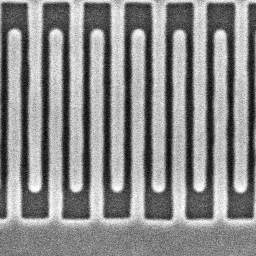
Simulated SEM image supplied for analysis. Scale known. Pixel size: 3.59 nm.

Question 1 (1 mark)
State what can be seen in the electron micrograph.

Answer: groups of lines, slits or small figures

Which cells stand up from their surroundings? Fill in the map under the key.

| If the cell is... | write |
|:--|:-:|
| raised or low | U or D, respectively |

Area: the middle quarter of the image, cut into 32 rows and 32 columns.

DDUUUDDUUUDDUUUDDUUUDDUUUDDUUUDD
DDUUUDDUUUDDUUUDDUUUDDUUUDDUUUDD
DDUUUDDUUUDDUUUDDUUUDDUUUDDUUUDD
DDUUUDDUUUDDUUUDDUUUDDUUUDDUUUDD
DDUUUDDUUUDDUUUDDUUUDDUUUDDUUUDD
DDUUUDDUUUDDUUUDDUUUDDUUUDDUUUDD
DDUUUDDUUUDDUUUDDUUUDDUUUDDDUUDD
DDUUUDDUUUDDUUUDDUUUDDUUUDDDUUDD
DDUUUDDUUUDDUUUDDUUUDDUUUDDUUUDD
DDUUUDDUUUDDUUUDDUUUDDUUUDDUUUDD
DDUUUDDUUUDDUUUDDUUUDDUUUDDUUUDD
DDUUUDDUUUDDUUUDDUUUDDUUUDDUUUDD
DDUUDDDUUUDDUUUDDUUUDDUUUDDUUUDD
DDUUDDDUUUDDUUUDDUUUDDUUUDDUUUDD
DDUUDDDUUUDDUUUDDUUUDDUUUDDUUUDD
DDUUUDDUUUDDUUUDDUUUDDUUUDDUUUDD
DDUUUDDUUUDDUUUDDUUUDDUUUDDUUUDD
DDUUUDDUUUDDUUUDDUUUDDUUUDDUUUDD
DDUUUDDUUUDDUUUDDUUUDDUUUDDUUUDD
DDUUUDDUUUDDUUUDDUUUDDUUUDDUUUDD
DDUUUDDUUUDDUUUDDUUUDDUUUDDUUUDD
DDUUUDDUUUDDUUUDDUUUDDUUUDDUUUDD
DDUUDDDUUDDDUUUDDUUUDDUUUDDUUUDD
DDUUDDDUUDDDUUUDDUUUDDUUUDDUUUDD
DUUUDDDUUDDDUUUDDUUUDDUUUDDUUUDD
DUUUDDDUUDDDUUUDDUUUDDUUUDDUUUDD
DUUUDDDUUDDDUUUDDUUUDDUUUDDUUUDD
DUUUDDDUUDDDUUUDDUUUDDUUUDDUUUDD
DUUUDDDUUDDDUUUDDUUUDDUUUDDUUUDD
DDUUDDDUUDDDUUUDDUUUDDUUUDDUUUDD
DDUUDDDUUDDDUUUDDUUUDDUUUDDUUUDD
DDUUDDDUUUDDUUDDDUUUDDUUUDDUUUDD